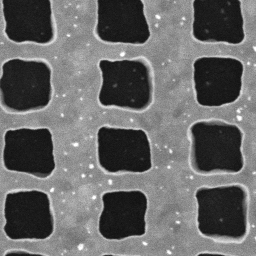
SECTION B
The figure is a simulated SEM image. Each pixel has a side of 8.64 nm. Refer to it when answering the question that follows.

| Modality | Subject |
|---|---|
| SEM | a regular array of holes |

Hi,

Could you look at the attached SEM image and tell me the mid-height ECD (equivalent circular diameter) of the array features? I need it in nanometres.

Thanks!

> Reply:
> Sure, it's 450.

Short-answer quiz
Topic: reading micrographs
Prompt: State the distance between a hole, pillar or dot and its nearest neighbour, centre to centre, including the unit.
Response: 0.559 micrometres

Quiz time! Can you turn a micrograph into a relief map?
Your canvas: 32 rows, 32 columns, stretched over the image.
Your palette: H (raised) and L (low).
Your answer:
LLLLLLHHHHHHLLLLLLHHHHHHLLLLLLHH
LLLLLLHHHHHHLLLLLLHHHHHHLLLLLLHH
HLLLLLHHHHHHLLLLLLHHHHHHLLLLLLHH
HLLLLLLHHHHHLLLLLLLHHHHHLLLLLLHH
HLLLLLLHHHHHLLLLLLLHHHHHLLLLLLLH
HHHHHHHHHHHHHHHHLLHHHHHHHHHHHHHH
HHHHHHHHHHHHHHHHHHHHHHHHHHHHHHHH
HLLHHHHHHHHHHHHHHHHHHHHHHLLLLLHH
LLLLLLHHHHHHLLLLLLHHHHHHLLLLLLHH
LLLLLLHHHHHHHLLLLLLHHHHHLLLLLLHH
LLLLLLHHHHHHHLLLLLLHHHHHLLLLLLHH
LLLLLLHHHHHHLLLLLLLHHHHHLLLLLLHH
LLLLLLHHHHHHLLLLLLLHHHHHHLLLLHHH
HLLLLHHHHHHHHHHHLLHHHHHHHHHHHHHH
HHHHHHHHHHHHHHHHHHHHHHHHHHHHHHHH
HHHHHHHHHHHHHHHHHHHHHHHHLLLLLHHH
HLLLLLHHHHHHLLLLLLHHHHHHLLLLLLHH
HLLLLLLHHHHHLLLLLLLHHHHHLLLLLLHH
HLLLLLLHHHHHLLLLLLLHHHHHLLLLLLHH
LLLLLLLHHHHHLLLLLLLHHHHHLLLLLLHH
HLLLLLLHHHHHHLLLLLLHHHHHLLLLLLHH
HHHLLLLHHHHHHHHHHLHHHHHHHLHHHHHH
HHHHHHHHHHHHHHHHHHHHHHHHHHHHHHHH
HHHHHHHHHHHHHHHHHHHHHHHHHHHLLLHH
HLLLLLHHHHHHHLLLLLHHHHHHHLLLLLLH
HLLLLLHHHHHHHLLLLLHHHHHHHLLLLLLH
LLLLLLHHHHHHHLLLLLHHHHHHHLLLLLLH
HLLLLLLHHHHHLLLLLLHHHHHHHLLLLLLH
HLLLLLLHHHHHLLLLLLHHHHHHHLLLLLLH
HLLLLLHHHHHHHLLLHHHHHHHHHHLLLLHH
HHHHHHHHHHHHHHHHHHHHHHHHHHHHHHHH
HHLHHHHHHHHHHHHHHHHHHHHHHHHHHHHH